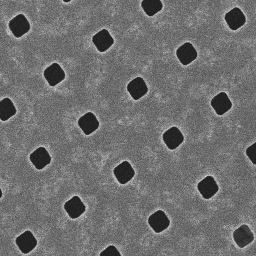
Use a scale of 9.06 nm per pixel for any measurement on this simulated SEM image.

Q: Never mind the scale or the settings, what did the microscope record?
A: a regular array of holes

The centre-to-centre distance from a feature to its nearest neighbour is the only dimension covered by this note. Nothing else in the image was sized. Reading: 539 nm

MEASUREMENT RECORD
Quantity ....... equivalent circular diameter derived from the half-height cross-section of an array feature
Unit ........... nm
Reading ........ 186